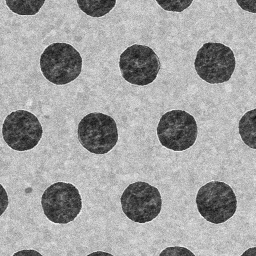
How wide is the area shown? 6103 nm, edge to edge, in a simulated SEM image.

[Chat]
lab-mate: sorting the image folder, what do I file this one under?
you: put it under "a regular array of holes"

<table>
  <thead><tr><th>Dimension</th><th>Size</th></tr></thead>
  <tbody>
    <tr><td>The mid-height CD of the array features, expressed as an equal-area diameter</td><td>989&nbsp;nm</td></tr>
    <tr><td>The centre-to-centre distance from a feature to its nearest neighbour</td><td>1820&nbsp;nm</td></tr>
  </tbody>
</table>